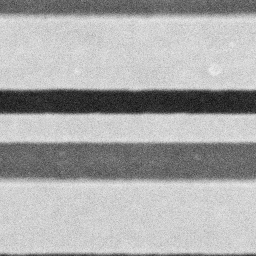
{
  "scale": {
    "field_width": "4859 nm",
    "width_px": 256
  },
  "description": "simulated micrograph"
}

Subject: lines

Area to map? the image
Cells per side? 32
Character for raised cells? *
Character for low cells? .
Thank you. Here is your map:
................................
................................
********************************
********************************
********************************
********************************
********************************
********************************
********************************
********************************
********************************
................................
................................
................................
********************************
********************************
********************************
********************************
................................
................................
................................
................................
................................
********************************
********************************
********************************
********************************
********************************
********************************
********************************
********************************
********************************